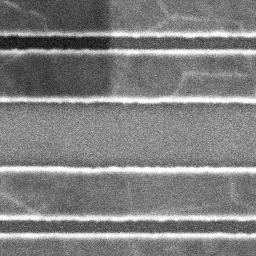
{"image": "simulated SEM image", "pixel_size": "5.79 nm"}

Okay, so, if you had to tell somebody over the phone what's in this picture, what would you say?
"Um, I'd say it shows lines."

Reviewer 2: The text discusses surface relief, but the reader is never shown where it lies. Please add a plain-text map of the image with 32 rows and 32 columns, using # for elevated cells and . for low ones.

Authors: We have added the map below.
################################
################################
################################
################################
.................#.....#.......#
................................
################################
################################
################################
################################
################################
################################
################################
................................
................................
................................
................................
................................
................................
................................
................................
################################
################################
################################
################################
################################
################################
................................
................................
################################
################################
################################